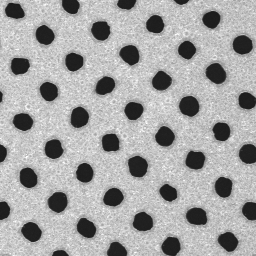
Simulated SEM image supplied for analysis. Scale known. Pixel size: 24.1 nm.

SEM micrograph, a regular array of holes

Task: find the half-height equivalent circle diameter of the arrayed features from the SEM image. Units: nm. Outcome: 460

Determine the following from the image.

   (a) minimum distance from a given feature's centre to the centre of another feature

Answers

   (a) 924 nm